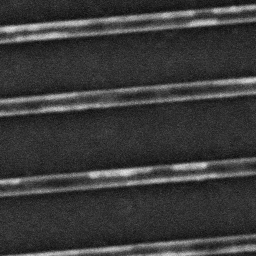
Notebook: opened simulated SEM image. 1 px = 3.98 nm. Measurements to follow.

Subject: one or a few lines or trenches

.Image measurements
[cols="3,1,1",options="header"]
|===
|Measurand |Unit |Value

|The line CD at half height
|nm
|62.9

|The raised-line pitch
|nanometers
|304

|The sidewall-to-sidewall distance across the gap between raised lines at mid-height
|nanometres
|242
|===